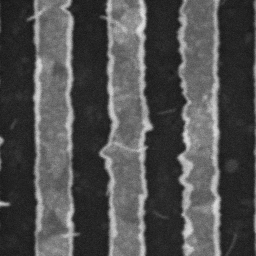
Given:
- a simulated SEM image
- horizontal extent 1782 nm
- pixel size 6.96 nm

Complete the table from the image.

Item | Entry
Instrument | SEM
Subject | one or a few lines or trenches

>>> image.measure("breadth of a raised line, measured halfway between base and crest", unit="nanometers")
230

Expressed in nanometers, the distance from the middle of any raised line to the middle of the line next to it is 510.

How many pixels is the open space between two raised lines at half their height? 40.5